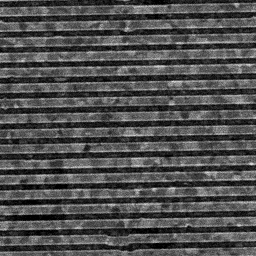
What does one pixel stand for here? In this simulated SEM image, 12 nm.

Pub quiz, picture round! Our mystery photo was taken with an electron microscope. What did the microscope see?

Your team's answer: parallel lines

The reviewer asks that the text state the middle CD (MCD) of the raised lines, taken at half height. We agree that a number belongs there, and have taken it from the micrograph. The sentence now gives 0.0961 um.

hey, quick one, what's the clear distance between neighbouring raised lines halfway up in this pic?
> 0.0871 um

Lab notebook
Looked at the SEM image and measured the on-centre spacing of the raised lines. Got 184 nanometers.